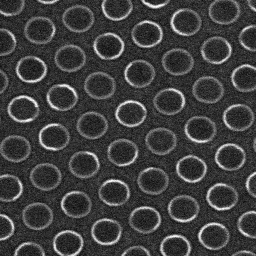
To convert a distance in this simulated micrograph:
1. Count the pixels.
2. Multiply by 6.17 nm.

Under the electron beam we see a regular array of raised bodies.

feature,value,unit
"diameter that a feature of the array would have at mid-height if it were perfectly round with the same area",170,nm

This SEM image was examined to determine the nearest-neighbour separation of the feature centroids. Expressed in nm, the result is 247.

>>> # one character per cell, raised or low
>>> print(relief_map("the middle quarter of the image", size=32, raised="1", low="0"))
11111000000000001111110001111111
11100000000000011111110000111110
00000001110000011111111000011100
00000011111100011111110000000000
00000111111110001111110000000000
10000111111110000111000000000000
11100111111110000000000001110000
11100011111100000000000111111100
11100000110000000000000111111100
11100000000000011100001111111100
11000000000000111111000111111100
10000000000001111111000111111000
00000111100001111111000001110000
00001111110001111111000000000000
00011111111000111110000000000001
00011111111000001100000000000011
10011111111000000000001111000011
10001111110000000000011111100001
10000011000000000000111111110001
10000000000011111000011111110000
00000000000111111100011111110000
00000000000111111100001111100000
00011111000111111100000110000000
00111111000111111100000000000011
01111111100011111000000000000111
01111111100000000000000000001111
00111111100000000000111110001111
00111111000000000001111110001111
00000000000000000001111111000111
00000000001111100001111111000001
00000000011111110001111111000000
00000000011111110001111110000000